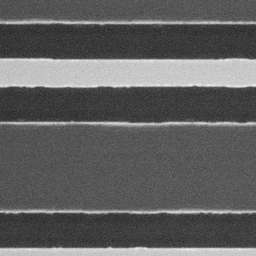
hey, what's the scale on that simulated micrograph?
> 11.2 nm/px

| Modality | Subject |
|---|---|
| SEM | lines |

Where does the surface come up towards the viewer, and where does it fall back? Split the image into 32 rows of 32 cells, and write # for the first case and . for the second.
################################
################################
################################
................................
................................
................................
................................
#######.....................###.
################################
################################
################################
................................
................................
................................
................................
################################
################################
################################
################################
################################
################################
################################
################################
################################
################################
################################
..................#.............
................................
................................
................................
................................
################################